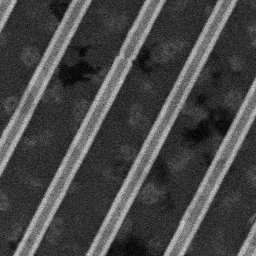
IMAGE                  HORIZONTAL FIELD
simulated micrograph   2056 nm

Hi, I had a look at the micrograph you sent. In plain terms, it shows one or a few lines or trenches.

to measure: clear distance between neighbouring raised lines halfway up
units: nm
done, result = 427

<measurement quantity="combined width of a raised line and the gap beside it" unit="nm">528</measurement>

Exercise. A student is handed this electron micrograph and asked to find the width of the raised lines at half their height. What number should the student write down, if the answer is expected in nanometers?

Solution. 102